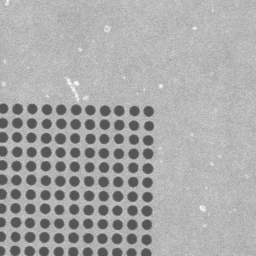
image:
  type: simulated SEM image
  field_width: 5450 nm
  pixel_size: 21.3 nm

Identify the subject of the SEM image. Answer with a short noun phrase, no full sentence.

a regular array of holes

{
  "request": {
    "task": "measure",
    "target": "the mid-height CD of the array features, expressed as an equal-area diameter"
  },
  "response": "11 px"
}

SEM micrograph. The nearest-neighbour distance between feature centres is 13.9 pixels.